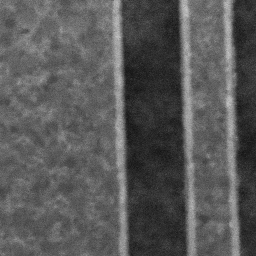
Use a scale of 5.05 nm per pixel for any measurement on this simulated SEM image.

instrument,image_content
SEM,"one or a few lines or trenches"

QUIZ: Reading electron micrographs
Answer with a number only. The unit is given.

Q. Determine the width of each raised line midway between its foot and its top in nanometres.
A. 218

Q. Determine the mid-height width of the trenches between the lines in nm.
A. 344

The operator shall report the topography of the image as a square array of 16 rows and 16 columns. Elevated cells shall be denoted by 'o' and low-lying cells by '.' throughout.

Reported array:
ooooooo.....oo..
ooooooo.....oo..
ooooooo.....oo..
ooooooo.....oo..
ooooooo.....oo..
ooooooo.....oo..
ooooooo.....oo..
oooooooo....oo..
oooooooo....oo..
oooooooo....oo..
oooooooo....oo..
oooooooo....ooo.
oooooooo....ooo.
oooooooo....ooo.
oooooooo....ooo.
oooooooo....ooo.